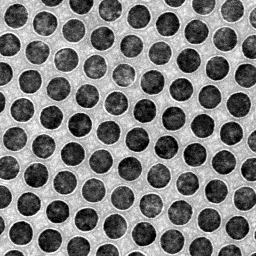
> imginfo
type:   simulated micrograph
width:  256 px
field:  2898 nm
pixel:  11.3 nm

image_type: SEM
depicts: a regular array of holes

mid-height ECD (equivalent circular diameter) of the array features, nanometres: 281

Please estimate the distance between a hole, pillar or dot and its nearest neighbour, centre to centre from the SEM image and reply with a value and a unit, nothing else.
335 nanometres